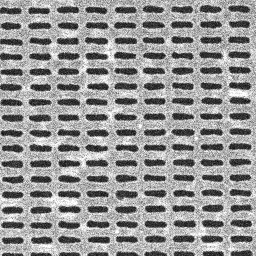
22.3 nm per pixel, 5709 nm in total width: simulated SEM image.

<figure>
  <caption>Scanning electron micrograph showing a regular array of holes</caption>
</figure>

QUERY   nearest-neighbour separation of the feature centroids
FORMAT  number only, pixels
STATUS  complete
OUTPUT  15